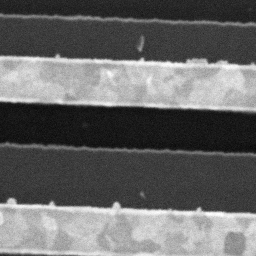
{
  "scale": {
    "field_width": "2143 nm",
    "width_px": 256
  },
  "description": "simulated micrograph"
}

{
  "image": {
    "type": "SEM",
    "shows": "lines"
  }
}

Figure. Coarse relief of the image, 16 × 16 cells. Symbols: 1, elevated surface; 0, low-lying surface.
0000000000000000
1111111111111110
1111111111111111
1111111111111111
1111111111111111
1111111111111111
0000011111111111
0000000000000000
0000000000000000
1111111111110000
1111111111111111
1111111111111111
1111111111111111
1111111111111111
1111111111111111
1111111111111111